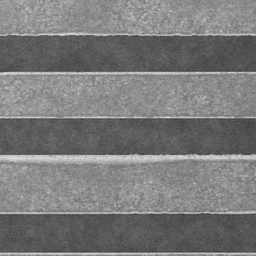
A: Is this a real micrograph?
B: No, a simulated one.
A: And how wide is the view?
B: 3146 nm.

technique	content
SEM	lines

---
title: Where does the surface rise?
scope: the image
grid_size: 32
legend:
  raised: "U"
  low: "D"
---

UUUUUUUUUUUUUUUUUUUUUUUUUUUUUUUU
UUUUUUUUUUUUUUUUUUUUUUUUUUUUUUUU
UUUUUUUUUUUUUUUUUUUUUUUUUUUUUUUU
UUUUUUUUUUUUUUUUUUUUUUUUUUUUUUUU
DDDDDDDDDDDDDDDDDDDDDDDDDDDDDDDD
DDDDDDDDDDDDDDDDDDDDDDDDDDDDDDDD
DDDDDDDDDDDDDDDDDDDDDDDDDDDDDDDD
DDDDDDDDDDDDDDDDDDDDDDDDDDDDDDDD
DDDDDDDDDDDDDDDDDDDDDDDDDDDDDDDD
UUUUUUUUUUUUUUUUUUUUUUUUUUUUUUUU
UUUUUUUUUUUUUUUUUUUUUUUUUUUUUUUU
UUUUUUUUUUUUUUUUUUUUUUUUUUUUUUUU
UUUUUUUUUUUUUUUUUUUUUUUUUUUUUUUU
UUUUUUUUUUUUUUUUUUUUUUUUUUUUUUUU
UUUUUUUUUUUUUUUUUUUUUUUUUUUUUUUU
DDDDDDDDDDDDDDDDDDDDDDDDDDDDDDDD
DDDDDDDDDDDDDDDDDDDDDDDDDDDDDDDD
DDDDDDDDDDDDDDDDDDDDDDDDDDDDDDDD
DDDDDDDDDDDDDDDDDDDDDDDDDDDDDDDD
DDDDDDDDDDDDDDDDDDDDUUUUUUUUUUUU
UUUUUUUUUUUUUUUUUUUUUUUUUUUUUUUU
UUUUUUUUUUUUUUUUUUUUUUUUUUUUUUUU
UUUUUUUUUUUUUUUUUUUUUUUUUUUUUUUU
UUUUUUUUUUUUUUUUUUUUUUUUUUUUUUUU
UUUUUUUUUUUUUUUUUUUUUUUUUUUUUUUU
UUUUUUUUUUUUUUUUUUUUUUUUUUUUUUUU
UUUUUUUUUUUUUUUUUUUUUUUUUUUUUUUU
DDDDDDDDDDDDDDDDDDDDDDDDDDDDDDDD
DDDDDDDDDDDDDDDDDDDDDDDDDDDDDDDD
DDDDDDDDDDDDDDDDDDDDDDDDDDDDDDDD
DDDDDDDDDDDDDDDDDDDDDDDDDDDDDDDD
DDDDDDDDDDDDDDDDDDDDDDDDDDDDDDDD